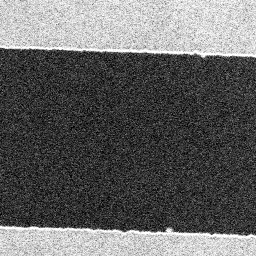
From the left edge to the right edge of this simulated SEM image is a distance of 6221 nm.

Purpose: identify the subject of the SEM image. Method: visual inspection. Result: one or a few lines or trenches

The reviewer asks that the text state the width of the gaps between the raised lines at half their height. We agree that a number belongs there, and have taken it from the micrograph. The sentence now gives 4390 nm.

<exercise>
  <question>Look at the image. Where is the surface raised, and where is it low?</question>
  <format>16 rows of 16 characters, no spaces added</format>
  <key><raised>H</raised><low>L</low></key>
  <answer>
HHHHHHHHHHHHHHHH
HHHHHHHHHHHHHHHH
HHHHHHHHHHHHHHHH
LLLLLLLLLLLLLLLL
LLLLLLLLLLLLLLLL
LLLLLLLLLLLLLLLL
LLLLLLLLLLLLLLLL
LLLLLLLLLLLLLLLL
LLLLLLLLLLLLLLLL
LLLLLLLLLLLLLLLL
LLLLLLLLLLLLLLLL
LLLLLLLLLLLLLLLL
LLLLLLLLLLLLLLLL
LLLLLLLLLLLLLLLL
HHHHHHHHLLLLLLLL
HHHHHHHHHHHHHHHH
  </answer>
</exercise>